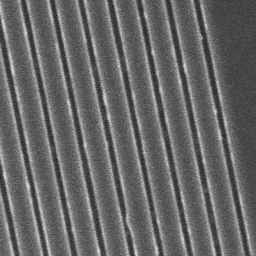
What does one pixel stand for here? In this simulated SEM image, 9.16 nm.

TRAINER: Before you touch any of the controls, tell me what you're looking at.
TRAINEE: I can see parallel lines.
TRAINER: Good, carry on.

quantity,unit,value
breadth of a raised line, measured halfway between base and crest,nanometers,196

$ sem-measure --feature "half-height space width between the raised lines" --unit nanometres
65.1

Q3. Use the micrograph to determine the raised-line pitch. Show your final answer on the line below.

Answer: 259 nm